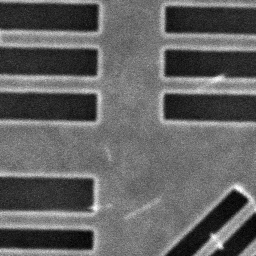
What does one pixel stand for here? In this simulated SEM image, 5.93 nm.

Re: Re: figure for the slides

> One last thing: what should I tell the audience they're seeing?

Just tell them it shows groups of lines, slits or small figures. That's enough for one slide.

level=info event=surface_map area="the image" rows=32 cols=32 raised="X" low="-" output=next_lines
------------XXXXXXXXXXXXXXXXXXXX
-------------XXXXXXXX-----------
------------XXXXXXXX------------
------------XXXXXXXX------------
XXXXXXXXXXXXXXXXXXXXXXXXXXXXXXXX
XXXXXXXXXXXXXXXXXXXXXXXXXXXXXXXX
------------XXXXXXXXX-----------
------------XXXXXXXX------------
------------XXXXXXXX------------
XX----------XXXXXXXXX-----------
XXXXXXXXXXXXXXXXXXXXXXXXXXXXXXXX
---------XXXXXXXXXXXXXXXXXXXXXXX
------------XXXXXXXX------------
------------XXXXXXXX------------
------------XXXXXXXX------------
XXXXXXXXXXXXXXXXXXXXXXXXXXXXXXXX
XXXXXXXXXXXXXXXXXXXXXXXXXXXXXXXX
XXXXXXXXXXXXXXXXXXXXXXXXXXXXXXXX
XXXXXXXXXXXXXXXXXXXXXXXXXXXXXXXX
XXXXXXXXXXXXXXXXXXXXXXXXXXXXXXXX
XXXXXXXXXXXXXXXXXXXXXXXXXXXXXXXX
XXXXXXXXXXXXXXXXXXXXXXXXXXXXXXXX
------------XXXXXXXXXXXXXXXXXXXX
------------XXXXXXXXXXXXXXXXXXXX
------------XXXXXXXXXXXXXXXX---X
------------XXXXXXXXXXXXXXX----X
-----------XXXXXXXXXXXXXXX----XX
XXXXXXXXXXXXXXXXXXXXXXXXX----XX-
---XXXXXXXXXXXXXXXXXXXXX----XX--
------------XXXXXXXXXXX----XX---
------------XXXXXXXXXX----XX---X
XXXXXXXXXXXXXXXXXXXXX----XX---XX